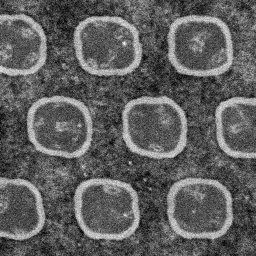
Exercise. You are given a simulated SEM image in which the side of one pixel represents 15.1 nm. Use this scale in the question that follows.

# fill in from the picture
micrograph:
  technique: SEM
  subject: raised bodies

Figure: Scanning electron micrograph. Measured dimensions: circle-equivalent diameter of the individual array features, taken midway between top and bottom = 916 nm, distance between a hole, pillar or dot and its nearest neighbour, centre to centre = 1400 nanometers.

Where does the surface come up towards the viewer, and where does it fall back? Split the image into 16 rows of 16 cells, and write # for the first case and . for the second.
................
##...###...###..
###..####..###..
###..####..###..
......##....#...
................
..###...###...##
..####..###...##
..####..###...##
...##....##...##
................
##...##....###..
##...###...###..
###..####..###..
##....##...###..
................